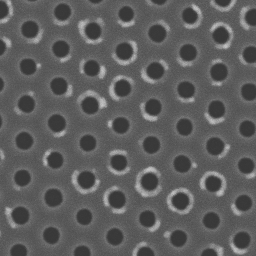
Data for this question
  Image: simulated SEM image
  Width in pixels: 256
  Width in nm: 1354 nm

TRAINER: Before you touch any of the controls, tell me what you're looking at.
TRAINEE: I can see a regular array of holes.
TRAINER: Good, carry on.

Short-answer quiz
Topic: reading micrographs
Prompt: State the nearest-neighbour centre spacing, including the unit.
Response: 0.192 microns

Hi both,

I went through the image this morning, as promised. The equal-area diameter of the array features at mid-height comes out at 17.3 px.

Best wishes